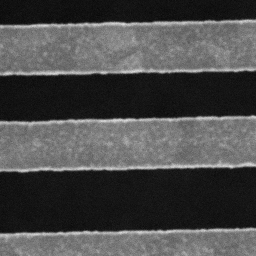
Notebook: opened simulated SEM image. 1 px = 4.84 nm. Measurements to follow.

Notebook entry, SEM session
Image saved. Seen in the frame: lines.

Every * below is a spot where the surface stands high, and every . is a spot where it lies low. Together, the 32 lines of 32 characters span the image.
................................
................................
................................
********************************
********************************
********************************
********************************
********************************
********************************
................................
................................
................................
................................
................................
................................
********************************
********************************
********************************
********************************
********************************
********************************
................................
................................
................................
................................
................................
................................
................................
................................
********************************
********************************
********************************